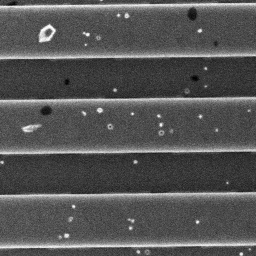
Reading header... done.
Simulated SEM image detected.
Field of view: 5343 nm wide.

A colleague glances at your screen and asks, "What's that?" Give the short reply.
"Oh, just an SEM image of wiring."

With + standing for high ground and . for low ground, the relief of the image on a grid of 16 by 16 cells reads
++++++++++++++++
++++++++++++++++
++++++++++++++++
++++++++++++++..
................
................
++++++++++++++++
++++++++++++++++
++++++++++++++++
++++++++++++....
................
................
++++++++++++++++
++++++++++++++++
++++++++++++++++
................